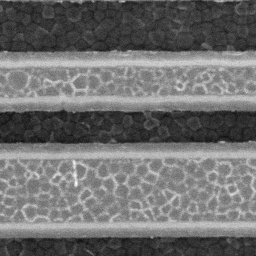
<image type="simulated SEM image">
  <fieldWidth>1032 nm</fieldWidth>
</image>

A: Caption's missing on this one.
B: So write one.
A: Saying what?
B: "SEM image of one or a few lines or trenches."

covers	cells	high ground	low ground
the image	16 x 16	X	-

----------------
----------------
----------------
----------------
XXXXXXXXXXXXXXXX
XXXXXXXXXXXXXXXX
----------------
----------------
----------------
----------------
XXXXXXXXXXXXXXXX
XXXXXXXXXXXXXXXX
XXXXXXXXXXXXXXXX
XXXXXXXXXXXXXXXX
----------------
----------------